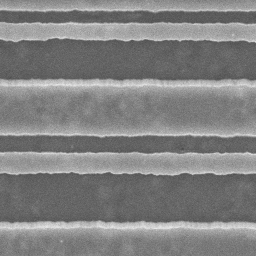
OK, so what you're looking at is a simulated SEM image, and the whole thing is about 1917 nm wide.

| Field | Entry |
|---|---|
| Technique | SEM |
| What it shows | lines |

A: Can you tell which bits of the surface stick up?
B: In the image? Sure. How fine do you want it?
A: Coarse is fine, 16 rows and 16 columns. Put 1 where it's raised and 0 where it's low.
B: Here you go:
1111111111111111
1111111111111111
0000000000000111
0000000000000000
0000000000000000
1111111111111111
1111111111111111
1111111111111111
1111111111111111
1111111111111111
1111111111111111
0000000000000000
0000000000000000
0000000000000000
1111111111111111
1111111111111111